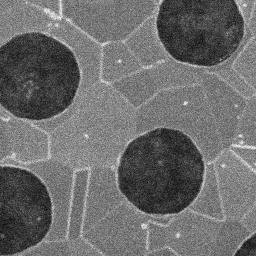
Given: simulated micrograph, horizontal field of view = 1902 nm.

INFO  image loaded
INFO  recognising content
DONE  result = holes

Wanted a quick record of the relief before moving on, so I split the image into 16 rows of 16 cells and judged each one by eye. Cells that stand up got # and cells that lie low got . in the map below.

##########.....#
##########.....#
#...######.....#
.....######...##
.....###########
.....###########
....############
################
#########...####
########....####
.######......###
...####......###
...#####....####
...#############
...#############
..#############.